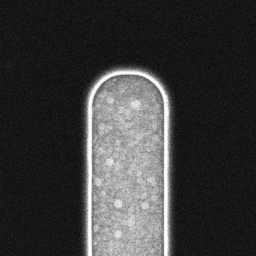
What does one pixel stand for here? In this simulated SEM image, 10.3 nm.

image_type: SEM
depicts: one or a few lines or trenches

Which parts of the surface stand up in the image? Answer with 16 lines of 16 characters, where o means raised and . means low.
oooooooooooooooo
oooooooooooooooo
oooooooooooooooo
oooooooooooooooo
oooooooooooooooo
oooooo....oooooo
oooooo....oooooo
oooooo....oooooo
oooooo....oooooo
oooooo....oooooo
oooooo....oooooo
oooooo....oooooo
oooooo....oooooo
oooooo....oooooo
oooooo....oooooo
oooooo....oooooo